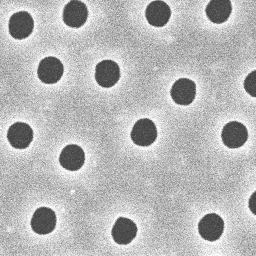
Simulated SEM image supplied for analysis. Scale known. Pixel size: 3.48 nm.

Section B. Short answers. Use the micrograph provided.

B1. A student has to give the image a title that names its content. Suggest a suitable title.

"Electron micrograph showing a regular array of holes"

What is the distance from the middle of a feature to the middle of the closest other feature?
198 nanometers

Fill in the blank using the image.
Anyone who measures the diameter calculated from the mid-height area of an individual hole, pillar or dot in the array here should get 95.3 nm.